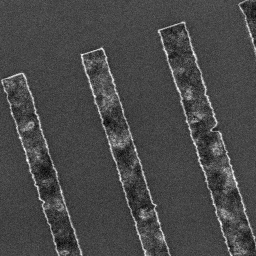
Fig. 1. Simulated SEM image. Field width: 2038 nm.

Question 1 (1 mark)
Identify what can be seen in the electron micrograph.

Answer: one or a few lines or trenches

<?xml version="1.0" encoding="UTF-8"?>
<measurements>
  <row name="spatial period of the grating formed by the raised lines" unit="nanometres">658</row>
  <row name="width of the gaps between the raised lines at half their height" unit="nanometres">468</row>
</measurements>